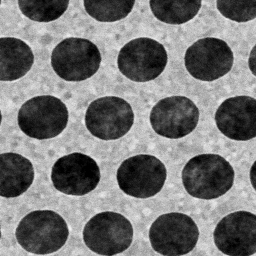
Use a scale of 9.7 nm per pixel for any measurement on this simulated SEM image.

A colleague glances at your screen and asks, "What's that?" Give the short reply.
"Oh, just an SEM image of a regular array of holes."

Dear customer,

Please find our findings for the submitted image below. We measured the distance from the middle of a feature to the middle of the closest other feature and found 640 nanometers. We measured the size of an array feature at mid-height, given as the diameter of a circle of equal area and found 467 nm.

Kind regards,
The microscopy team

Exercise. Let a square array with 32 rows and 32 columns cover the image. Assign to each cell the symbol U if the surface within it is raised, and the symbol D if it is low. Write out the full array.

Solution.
UUDDDDDDDUDDDDDDDUUDDDDDDUUDDDDD
UUUDDDDDUUUDDDDDUUUDDDDDDUUDDDDD
UUUUDDDUUUUUDDDUUUUUDDDDUUUUUDDD
UUUUUUUUUUUUUUUUUUUUUUUUUUUUUUUU
DUUUUUUUUUUUUUUDUUUUUUUUUUUUUUUU
DDDUUUUDDDDDUUUUDDDDUUUUDDDDUUUU
DDDDUUDDDDDDDUUDDDDDDUUDDDDDDUUD
DDDDUUDDDDDDDUUDDDDDDUUDDDDDDUUD
DDDDUUUDDDDDUUUDDDDDDUUDDDDDDUUD
DDDUUUUDDDDDUUUDDDDDUUUUDDDDUUUU
UUUUUUUUUUUUUUUUUUUUUUUUUUUUUUUU
UUUUUUUUUUUUUUUUUUUUUUUUUUUUUUUU
UUUDDDDDUUUUDDDDUUUUDDDDUUUUDDDD
UUDDDDDDUUUDDDDDDUUDDDDDDUUDDDDD
UUDDDDDDDUUDDDDDDUUDDDDDDUUDDDDD
UUDDDDDDUUUDDDDDDUUDDDDDDUUDDDDD
UUUDDDDDUUUDDDDDUUUDDDDDUUUDDDDD
UUUUUDUUUUUUDDDUUUUUUUUUUUUUUDDU
UUUUUUUUUUUUUUUUUUUUUUUUUUUUUUUU
DDDUUUUUDDDUUUUUDDDUUUUUDDDDUUUU
DDDDUUUDDDDDUUUDDDDDDUUDDDDDDUUU
DDDDUUDDDDDDDUUDDDDDDUUDDDDDDUUD
DDDDUUDDDDDDDUUDDDDDDUUDDDDDDUUD
DDDDUUUDDDDDUUUDDDDDUUUDDDDDDUUU
DDDUUUUUUDUUUUUUDDDUUUUUDDDDUUUU
UUUUUUUUUUUUUUUUUUUUUUUUUUUUUUUU
UUUUDDDUUUUUDDDUUUUUUUUUUUUUUDDU
UUUDDDDDUUUDDDDDUUUDDDDDUUUDDDDD
UUDDDDDDDUDDDDDDDUUDDDDDDUUDDDDD
UUDDDDDDDUDDDDDDDUDDDDDDDUUDDDDD
UUDDDDDDUUUDDDDDUUUDDDDDDUUDDDDD
UUUDDDDUUUUDDDDUUUUDDDDDUUDUDDDD